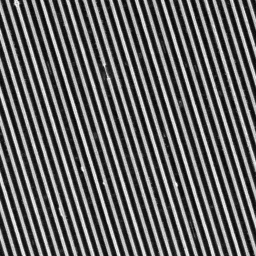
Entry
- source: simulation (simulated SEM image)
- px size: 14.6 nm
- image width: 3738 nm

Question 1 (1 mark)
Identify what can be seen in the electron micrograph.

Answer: parallel lines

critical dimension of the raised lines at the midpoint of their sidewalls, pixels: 2.87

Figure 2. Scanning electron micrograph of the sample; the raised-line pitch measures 0.12 um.